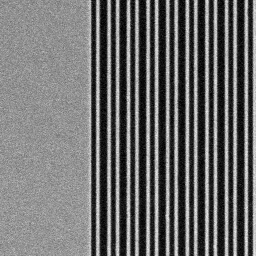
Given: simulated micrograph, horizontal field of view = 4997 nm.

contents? parallel lines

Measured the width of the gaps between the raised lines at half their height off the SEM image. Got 6 pixels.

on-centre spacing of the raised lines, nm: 193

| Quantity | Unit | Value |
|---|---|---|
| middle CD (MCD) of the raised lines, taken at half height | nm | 53.7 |